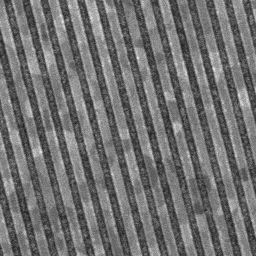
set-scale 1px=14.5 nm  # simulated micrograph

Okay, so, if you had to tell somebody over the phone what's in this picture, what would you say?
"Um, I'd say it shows parallel lines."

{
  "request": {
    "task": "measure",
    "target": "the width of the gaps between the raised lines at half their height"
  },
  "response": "0.128 um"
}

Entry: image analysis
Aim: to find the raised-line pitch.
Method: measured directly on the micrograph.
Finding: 258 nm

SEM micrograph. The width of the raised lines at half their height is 128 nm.